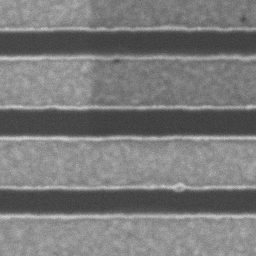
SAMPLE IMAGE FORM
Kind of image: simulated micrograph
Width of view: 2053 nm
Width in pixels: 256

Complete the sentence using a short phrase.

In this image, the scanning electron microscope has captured lines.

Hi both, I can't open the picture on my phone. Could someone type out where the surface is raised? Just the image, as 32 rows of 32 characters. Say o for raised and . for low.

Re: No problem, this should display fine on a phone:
................................
................................
................................
........................o.......
oooooooooooooooooooooooooooooooo
oooooooooooooooooooooooooooooooo
oooooooooooooooooooooooooooooooo
................................
................................
................................
................................
................................
................................
oooooooooooooooooooooooooooooooo
oooooooooooooooooooooooooooooooo
oooooooooooooooooooooooooooooooo
oooooooooooooooooooooooooooooooo
................................
................................
................................
................................
................................
................................
ooooooooo...oooooooooooo.ooooooo
oooooooooooooooooooooooooooooooo
oooooooooooooooooooooooooooooooo
oooooooooooooooooooooooooooooooo
................................
................................
................................
................................
................................